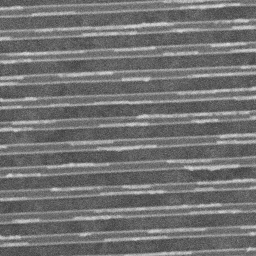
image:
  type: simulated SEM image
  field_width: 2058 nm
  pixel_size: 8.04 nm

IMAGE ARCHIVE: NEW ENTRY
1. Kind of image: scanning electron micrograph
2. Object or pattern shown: parallel lines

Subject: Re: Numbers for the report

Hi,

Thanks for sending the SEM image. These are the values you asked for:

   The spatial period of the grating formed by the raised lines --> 0.184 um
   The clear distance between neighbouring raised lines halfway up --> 107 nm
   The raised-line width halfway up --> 78.3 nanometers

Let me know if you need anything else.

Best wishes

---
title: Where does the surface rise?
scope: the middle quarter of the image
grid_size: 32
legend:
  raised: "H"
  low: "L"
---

LLLLLLLLLLLLLLLLLLLLLLLLLLLLLLLL
LLLLLLLLLLLLLLLLLLLLLLLLLLHHHHHH
HHHHHHHHHHHHHHHHHHHHHHHHHHHHHHHH
HHHHHHHHHHHHHHHHHHHHHHHHHHLLLLLL
HHHHLLLLLLLLLLLLLLLLLLLLLLLLLLLL
LLLLLLLLLLLLLLLLLLLLLLLLLLLLLLLL
LLLLLLLLLLLLLLLLLLLLLLLLLLLLLLLL
LLLLLLLLLLLLLLLLLLLLLHHHHHHHHHHH
HHHHHHHHHHHHHHHHHHHHHHHHHHHHHHHH
HHHHHHHHHHHHHHHHHHHHHHHHHHLLLLLL
LLLLLLLLLLLLLLLLLLLLLLLLLLLLLLLL
LLLLLLLLLLLLLLLLLLLLLLLLLLLLLLLL
LLLLLLLLLLLLLLLLLLLLLLLLLLLLLLLL
LLLLLLLLLLLHHHHHHHHHHHHHHHHHHHHH
HHHHHHHHHHHHHHHHHHHHHHHHHHHHHHHH
HHHHHHHHHHHHLLLLLLLLLLLLLLLLLLLL
LLLLLLLLLLLLLLLLLLLLLLLLLLLLLLLL
LLLLLLLLLLLLLLLLLLLLLLLLLLLLLLLL
LLLLLLLLLLLLLLLLLLLLLLLLLLLLHHHH
LLHHHHHHHHHHHHHHHHHHHHHHHHHHHHHH
HHHHHHHHHHHHHHHHHHHHHHHHHHHHHLLL
HHHHHHHLLLHHLHHLLLLLLLLLLLLLLLLL
LLLLLLLLLLLLLLLLLLLLLLLLLLLLLLLL
LLLLLLLLLLLLLLLLLLLLLLLLLLLLLLLL
LLLLLLLLLLLLLLLLLLLHHHHHHHHHHHHH
HHHHHHHHHHHHHHHHHHHHHHHHHHHHHHHH
HHHHHHHHHHHHHHHHHHHLLLLLLLLLLLLH
HHLLLLLLLLLLLLLLLLLLLLLLLLLLLLLL
LLLLLLLLLLLLLLLLLLLLLLLLLLLLLLLL
LLLLLLLLLLLLLLLLLLLLLLLLLLLLLLLL
LLLLLLLLLLLLLLHHHLLHHHHHHHHHHHHH
HHHHHHHHHHHHHHHHHHHHHHHHHHHHHHHH